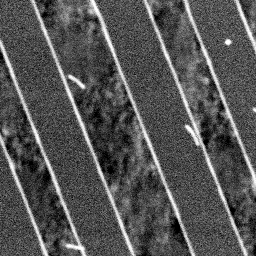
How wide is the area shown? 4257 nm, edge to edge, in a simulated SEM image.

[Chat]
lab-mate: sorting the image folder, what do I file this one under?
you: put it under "groups of lines, slits or small figures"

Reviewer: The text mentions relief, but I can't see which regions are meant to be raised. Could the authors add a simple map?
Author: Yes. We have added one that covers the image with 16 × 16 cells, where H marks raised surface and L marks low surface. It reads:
HHLLLLHHHLLLHHHL
HHHLLLHHHHLLHHHL
HHHLLLLHHHLLHHHH
HHHLLLLHHHLLLHHH
LHHHLLLLHHHLLHHH
LHHHLLLLHHHLLLHH
LHHHHLLLHHHHLLHH
LLHHHLLLLHHHLLHH
LLHHHLLLLHHHLLLH
LLLHHHLLLLHHHLLH
HLLHHHLLLLHHHLLL
HLLHHHHLLLHHHHLL
HHLLHHHLLLLHHHLL
HHLLHHHLLLLHHHLL
HHLLLHHHLLLHHHHL
HHHLLHHHLLLLHHHL